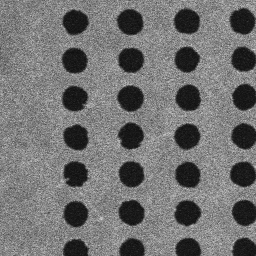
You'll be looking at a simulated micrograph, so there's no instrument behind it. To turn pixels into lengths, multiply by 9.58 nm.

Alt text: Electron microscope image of a regular array of holes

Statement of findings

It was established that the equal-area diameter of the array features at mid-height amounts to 0.249 µm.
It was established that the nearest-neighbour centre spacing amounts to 365 nanometres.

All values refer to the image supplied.